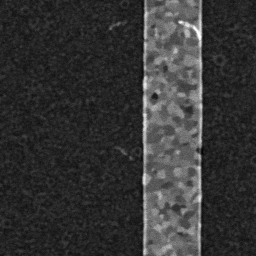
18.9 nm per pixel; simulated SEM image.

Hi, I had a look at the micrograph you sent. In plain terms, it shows one or a few lines or trenches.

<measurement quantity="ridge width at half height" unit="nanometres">1060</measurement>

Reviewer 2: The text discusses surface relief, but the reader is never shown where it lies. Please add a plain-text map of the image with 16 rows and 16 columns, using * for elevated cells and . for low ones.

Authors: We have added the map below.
.........****...
.........****...
.........****...
.........****...
.........****...
.........****...
.........****...
.........****...
.........****...
.........***....
.........***....
.........***....
.........***....
.........***....
.........***....
.........***....